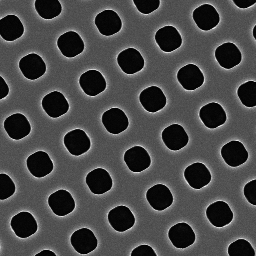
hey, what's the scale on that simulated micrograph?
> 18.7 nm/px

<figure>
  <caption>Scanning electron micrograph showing a regular array of holes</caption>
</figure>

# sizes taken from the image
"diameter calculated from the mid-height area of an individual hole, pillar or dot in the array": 0.487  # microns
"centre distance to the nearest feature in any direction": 812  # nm